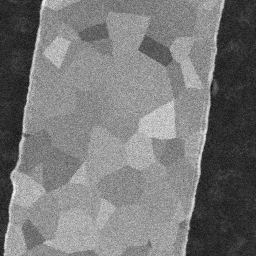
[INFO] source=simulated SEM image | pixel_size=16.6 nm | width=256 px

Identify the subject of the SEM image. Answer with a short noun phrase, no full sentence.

one or a few lines or trenches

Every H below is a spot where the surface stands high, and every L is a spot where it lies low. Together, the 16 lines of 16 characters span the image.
LLLHHHHHHHHHHHLL
LLLHHHHHHHHHHHLL
LLHHHHHHHHHHHLLL
LLHHHHHHHHHHHLLL
LLHHHHHHHHHHHLLL
LLHHHHHHHHHHHLLL
LLHHHHHHHHHHHLLL
LLHHHHHHHHHHHLLL
LHHHHHHHHHHHHLLL
LHHHHHHHHHHHHLLL
LHHHHHHHHHHHLLLL
LHHHHHHHHHHHLLLL
LHHHHHHHHHHHLLLL
LHHHHHHHHHHHLLLL
HHHHHHHHHHHHLLLL
HHHHHHHHHHHHLLLL